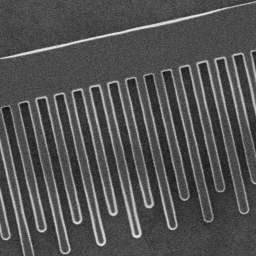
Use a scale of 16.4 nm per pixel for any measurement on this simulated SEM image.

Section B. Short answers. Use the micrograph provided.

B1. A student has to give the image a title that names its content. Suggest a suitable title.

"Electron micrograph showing groups of lines, slits or small figures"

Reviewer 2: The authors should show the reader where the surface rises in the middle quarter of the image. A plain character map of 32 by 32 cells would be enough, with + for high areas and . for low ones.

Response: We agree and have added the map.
++++++++++++++++++++++++++++++++
+++++++++++++++++++++++++++++...
+++++++++++++++++++++++++..++...
+++++++++++++++++.++...++..++...
++++++++++++++++..++...++..++...
+++++++..++...++..++...++...++..
++++++...++...++..+++..++...++..
++...++..++...++...++..+++..++..
++...++...++..++...++...++..+++.
++...++...++..+++..++...++...++.
.++..++...++...++...++..++...++.
.++...++..++...++...++..++...++.
.++...++...++..++...++...++..++.
.++...++...++...++..++...++..+++
..++..++...++...++..++...++...++
..++...++..++...++..+++..++...++
..++...++..++...++...++..+++..++
..++...++...++..++...++...++..++
..++...++...++..+++..++...++...+
...++..++...++...++..+++..++...+
...++...++..++...++...++..++...+
+..++...++..+++..++...++...++..+
+..+++..++...++..+++..++...++...
+..+++..++...++...++..+++..++...
+...++...++..++...++...++..++...
++..++...++..+++..++...++..+++..
++..++...++..+++..++...++...++..
++..++...++...++..+++..++...++..
++...++..++...++...++..+++..++..
++...++...++..++...++...++..+++.
+++..++...++..+++..++...++...++.
.++..++...++...++...+...++...++.